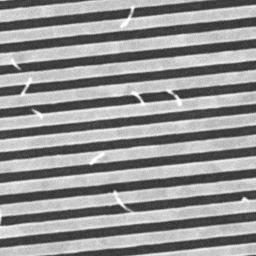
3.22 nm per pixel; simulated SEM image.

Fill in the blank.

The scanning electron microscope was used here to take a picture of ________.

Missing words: parallel lines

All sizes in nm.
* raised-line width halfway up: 35.6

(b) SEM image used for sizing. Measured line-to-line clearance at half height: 32.8 nm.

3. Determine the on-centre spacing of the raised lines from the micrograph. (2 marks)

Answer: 69.2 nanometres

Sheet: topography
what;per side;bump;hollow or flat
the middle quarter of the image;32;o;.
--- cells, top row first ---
.......ooooooooooooooooooooooooo
oooooooooooooooooooooooo........
ooooooooooooo...................
oooo...........................o
....................oooooooooooo
..........oooooooooooooooooooooo
.oooooooooooooooooooooooooo.....
ooooooooooooooooooo.............
oooooooo........................
.........................ooooooo
................oooooooooooooooo
......ooooooooooooooooooooooooo.
ooooooooooooooooooooo...........
oooooooooooo....................
oo..........................oooo
...................ooooooooooooo
.........ooooooooooooooooooooooo
ooooooooooooooooooooooooo.......
ooooooooooooooo.................
oooooo..........................
......................oooooooooo
.............ooooooooooooooooooo
...ooooooooooooooooooooooooooo..
oooooooooooooooooo.o............
ooooooooooo.....................
o..........................ooooo
.................ooooooooooooooo
.......ooooooooooooooooooooooooo
oooooooooooooooooooooooo........
oooooooooooooo..................
oooooo.........................o
.....................ooooooooooo